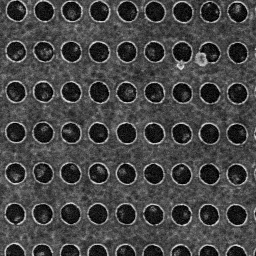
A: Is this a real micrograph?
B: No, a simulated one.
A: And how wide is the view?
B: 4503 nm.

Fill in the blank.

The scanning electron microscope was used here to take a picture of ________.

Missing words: a regular array of holes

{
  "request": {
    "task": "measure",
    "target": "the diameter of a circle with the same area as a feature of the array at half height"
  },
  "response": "356 nm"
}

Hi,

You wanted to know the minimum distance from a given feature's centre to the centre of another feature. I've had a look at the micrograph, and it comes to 486 nm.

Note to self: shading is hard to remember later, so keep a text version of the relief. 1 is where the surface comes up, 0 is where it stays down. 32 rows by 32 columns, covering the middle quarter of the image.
11111111111111111111111111111111
11111111111111111111111111111111
11111111111111111111111111111111
11111111111111111111111111111111
10111111011111101111110111111111
00001110000111000111100001110001
00001100000110000011000001100000
00001100000110000011000001100000
00001110000111000011100001110000
10011111001111100111110011111001
11111111111111111111111111111111
11111111111111111111111111111111
11111111111111111111111111111111
11111111111111111111111111111111
11111111111111111111111111111111
00011110001111000111100011110001
00001100000110000011000001100000
00001100000110000011000001100000
00001100000111000011100001100000
10011110001111000111100011110001
11111111111111111111111111111111
11111111111111111111111111111111
11111111111111111111111111111111
11111111111111111111111111111111
11111111111111111111111111111111
00011110001111000111100011110001
00001100000110000011000001100000
00001100000110000011000001100000
00001110000110000011000001100000
10011111001111000111100011110001
11111111111111111111111111111111
11111111111111111111111111111111